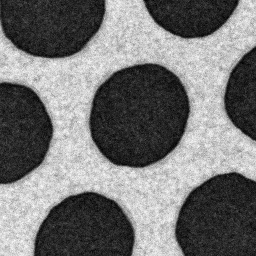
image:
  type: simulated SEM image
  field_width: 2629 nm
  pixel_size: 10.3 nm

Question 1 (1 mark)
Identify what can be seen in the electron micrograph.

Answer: holes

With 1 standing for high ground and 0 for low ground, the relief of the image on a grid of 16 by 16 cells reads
0000000110000001
0000001111000011
1000001111111111
1100111111111110
1111111000011100
0011110000001100
0001110000001100
0001110000001100
0001110000011110
0001110000011111
0011111111111111
1111111111111000
1111000111110000
1110000011100000
1100000011100000
1100000011100000